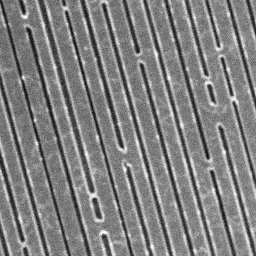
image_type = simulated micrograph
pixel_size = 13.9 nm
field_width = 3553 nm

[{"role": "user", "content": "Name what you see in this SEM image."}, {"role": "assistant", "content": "parallel lines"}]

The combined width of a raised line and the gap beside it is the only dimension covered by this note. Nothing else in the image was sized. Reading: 278 nm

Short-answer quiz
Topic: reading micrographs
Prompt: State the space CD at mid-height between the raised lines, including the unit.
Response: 78.8 nm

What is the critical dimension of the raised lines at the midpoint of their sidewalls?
199 nm